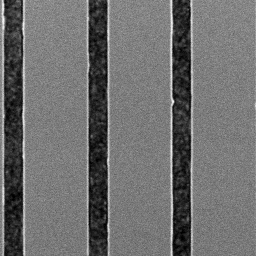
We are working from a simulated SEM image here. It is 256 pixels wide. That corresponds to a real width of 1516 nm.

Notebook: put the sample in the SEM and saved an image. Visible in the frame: one or a few lines or trenches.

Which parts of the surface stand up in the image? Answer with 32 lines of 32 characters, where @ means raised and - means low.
---@@@@@@@@---@@@@@@@---@@@@@@@@
---@@@@@@@@---@@@@@@@---@@@@@@@@
---@@@@@@@@---@@@@@@@---@@@@@@@@
---@@@@@@@@---@@@@@@@---@@@@@@@@
--@@@@@@@@@---@@@@@@@---@@@@@@@@
-@@@@@@@@@@--@@@@@@@@---@@@@@@@@
--@@@@@@@@@---@@@@@@@---@@@@@@@@
---@@@@@@@@--@@@@@@@@---@@@@@@@@
---@@@@@@@@--@@@@@@@@---@@@@@@@@
---@@@@@@@@--@@@@@@@@---@@@@@@@@
---@@@@@@@@---@@@@@@@---@@@@@@@@
---@@@@@@@@---@@@@@@@@--@@@@@@@@
---@@@@@@@@---@@@@@@@@--@@@@@@@@
---@@@@@@@@--@@@@@@@@@--@@@@@@@@
---@@@@@@@@--@@@@@@@@---@@@@@@@@
---@@@@@@@@--@@@@@@@@---@@@@@@@@
---@@@@@@@@---@@@@@@@---@@@@@@@@
---@@@@@@@@---@@@@@@@---@@@@@@@@
---@@@@@@@@---@@@@@@@---@@@@@@@@
---@@@@@@@@--@@@@@@@@---@@@@@@@@
---@@@@@@@@--@@@@@@@@---@@@@@@@@
@--@@@@@@@@--@@@@@@@@---@@@@@@@@
---@@@@@@@@---@@@@@@@---@@@@@@@@
---@@@@@@@@---@@@@@@@---@@@@@@@@
---@@@@@@@@---@@@@@@@@@-@@@@@@@@
---@@@@@@@@--@@@@@@@@---@@@@@@@@
---@@@@@@@@@-@@@@@@@@---@@@@@@@@
---@@@@@@@@@@@@@@@@@@@--@@@@@@@@
---@@@@@@@@---@@@@@@@---@@@@@@@@
---@@@@@@@@---@@@@@@@---@@@@@@@@
---@@@@@@@@---@@@@@@@---@@@@@@@@
---@@@@@@@@---@@@@@@@---@@@@@@@@